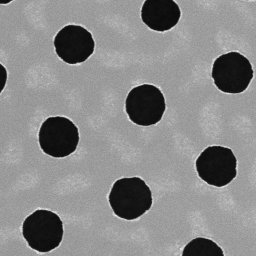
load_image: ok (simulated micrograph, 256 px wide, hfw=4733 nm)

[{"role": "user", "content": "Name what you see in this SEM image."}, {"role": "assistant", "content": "holes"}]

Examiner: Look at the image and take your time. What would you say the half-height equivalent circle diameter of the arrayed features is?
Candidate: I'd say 0.759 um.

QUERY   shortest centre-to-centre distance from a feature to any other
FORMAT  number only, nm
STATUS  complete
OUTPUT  1710